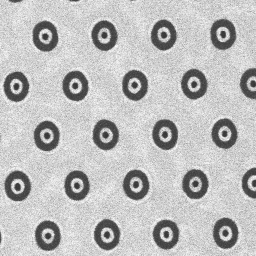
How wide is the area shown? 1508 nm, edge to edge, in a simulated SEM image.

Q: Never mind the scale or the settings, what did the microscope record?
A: a regular array of ring-shaped grooves with a dot in the middle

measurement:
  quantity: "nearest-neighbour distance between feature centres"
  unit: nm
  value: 340